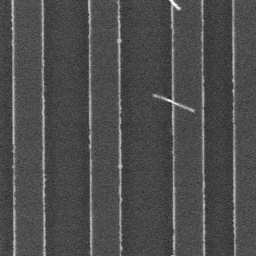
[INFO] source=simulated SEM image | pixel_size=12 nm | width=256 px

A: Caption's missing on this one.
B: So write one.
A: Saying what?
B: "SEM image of lines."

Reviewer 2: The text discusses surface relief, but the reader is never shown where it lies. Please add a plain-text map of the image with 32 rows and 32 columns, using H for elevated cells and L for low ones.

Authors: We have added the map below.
LLHHHLLLLLLHHHHLLLLLLHHHHLLLLHHH
LLHHHLLLLLLHHHHLLLLLLHHHHLLLLHHH
LLHHHLLLLLLHHHHLLLLLLHHHHLLLLHHH
LLHHHLLLLLLHHHHLLLLLLHHHHLLLLHHH
LLHHHLLLLLLHHHHLLLLLLLHHHLLLLHHH
LLHHHLLLLLLHHHHLLLLLLLHHHLLLLHHH
LLHHHLLLLLLHHHHLLLLLLLHHHLLLLHHH
LLHHHLLLLLLHHHHLLLLLLLHHHLLLLHHH
LLHHHLLLLLLHHHHLLLLLLLHHHLLLLHHH
LLHHHLLLLLLHHHHLLLLLLLHHHLLLLHHH
LLHHHLLLLLLHHHHLLLLLLLHHHLLLLHHH
LLHHHLLLLLLHHHHLLLLLLLHHHLLLLHHH
LLHHHLLLLLLHHHHLLLLLLHHHHLLLLHHH
LLHHHLLLLLLHHHHLLLLLLLHHHLLLLHHH
LLHHHLLLLLLHHHHLLLLLLLHHHLLLLHHH
LLHHHLLLLLLHHHHLLLLLLLHHHLLLLHHH
LLHHHLLLLLLHHHHLLLLLLLHHHLLLLHHH
LLHHHLLLLLLHHHHLLLLLLLHHHLLLLHHH
LLHHHLLLLLLHHHHLLLLLLLHHHLLLLHHH
LLHHHLLLLLLHHHHLLLLLLLHHHLLLLHHH
LLHHHLLLLLLHHHHLLLLLLLHHHLLLLHHH
LLHHHLLLLLLHHHHLLLLLLLHHHHLLLHHH
LLHHHHLLLLLHHHHLLLLLLLHHHHLLLHHH
LLHHHLLLLLLHHHHLLLLLLLHHHHLLLHHH
LLHHHLLLLLLHHHHLLLLLLLHHHLLLLHHH
LLHHHLLLLLLHHHHLLLLLLLHHHHLLLHHH
LLHHHHLLLLLHHHHLLLLLLLHHHHLLLHHH
LLHHHHLLLLLHHHHLLLLLLLHHHHLLLHHH
LLHHHHLLLLLHHHHLLLLLLLHHHHLLLHHH
LLHHHHLLLLLHHHHLLLLLLLHHHHLLLHHH
LLHHHHLLLLLHHHHLLLLLLLHHHHLLLHHH
LLHHHHLLLLLHHHHLLLLLLLHHHHLLLHHH